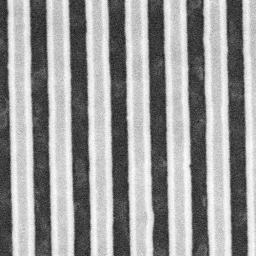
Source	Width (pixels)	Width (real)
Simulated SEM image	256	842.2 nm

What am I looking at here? parallel lines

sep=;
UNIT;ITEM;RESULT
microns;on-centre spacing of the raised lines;0.129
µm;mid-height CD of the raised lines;0.0567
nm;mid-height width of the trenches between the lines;71.5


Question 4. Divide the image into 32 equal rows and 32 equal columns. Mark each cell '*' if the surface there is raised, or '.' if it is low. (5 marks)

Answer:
.**...**...**...**...**...**...*
.**...**...**...**...**...**...*
.**...**...**...**...**...**...*
.**...**...**...**...**...**...*
.**...**...**...**...**...**...*
.**...**...**...**...**...**...*
.***..**...**...**...**...**...*
.***..**...**...**...**...**...*
.**...**...**...**...**...**...*
.**...**...**...**...**...**...*
.***..**...**...**...**...**...*
.***..**...**...**...**...**...*
..**..***..**...**...**...**...*
..**...**..***..**...**...**...*
..**...**..***..**...**...**...*
..**..***..***..**...**...**...*
..**..***..***..**...**...**...*
..**..***..***..**...**...**...*
..**..***..***..**...**...**...*
..**...**..***..***..**...**...*
..**...**...**..***..**...**...*
..**...**...**..***..**...**...*
..**...**...**..***..**...**...*
..**...**...**..**...**...**...*
..**...**...**..***..***..**...*
..**...**...**..***..***..**...*
..**...**...**...**..***..**...*
..**...**...**...**..***..***..*
..**...**...**...**..***..***..*
..**...**...**...**..***..***..*
..**...**...**...**...**..***..*
..**...**...**...**..***..**...*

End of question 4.